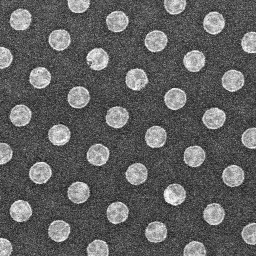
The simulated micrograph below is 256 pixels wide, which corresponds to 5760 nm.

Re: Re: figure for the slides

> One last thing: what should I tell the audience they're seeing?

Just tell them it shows a regular array of raised bodies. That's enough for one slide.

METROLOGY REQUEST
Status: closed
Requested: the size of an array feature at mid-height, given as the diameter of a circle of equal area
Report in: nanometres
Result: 471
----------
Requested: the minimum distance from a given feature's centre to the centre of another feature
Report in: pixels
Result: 42.4